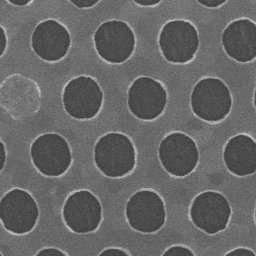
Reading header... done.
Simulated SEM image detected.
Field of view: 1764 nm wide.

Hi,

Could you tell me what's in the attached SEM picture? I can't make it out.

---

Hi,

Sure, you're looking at a regular array of holes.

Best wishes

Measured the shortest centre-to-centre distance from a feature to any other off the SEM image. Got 439 nm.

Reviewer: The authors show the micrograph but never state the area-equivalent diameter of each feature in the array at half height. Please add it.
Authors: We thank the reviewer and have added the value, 0.286 micrometres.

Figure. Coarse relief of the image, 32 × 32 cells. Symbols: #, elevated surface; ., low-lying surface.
##.######...#####...#####...####
################################
######################.#######.#
#####...####....####....####....
.###.....###.....###.....###....
.###.....###.....###.....###....
.###....####.....###....####....
######.######...#####...#####...
################################
################################
########....#####...#####...####
########.....###.....###.....###
########.....###.....###.....###
########.....###.....###.....###
#########...#####...#####...####
################################
################################
####....####....####....#####...
.###.....###.....###.....###....
.###.....###.....###.....###....
.###.....###.....###.....###....
#####...#####...#####...#####...
################################
################################
#...#####...####....#####...####
....####.....###....####.....###
.....###.....###.....###.....###
.....###.....###.....###.....###
#...#####...####....#####...####
################################
################################
#####...#####...#####...#####...